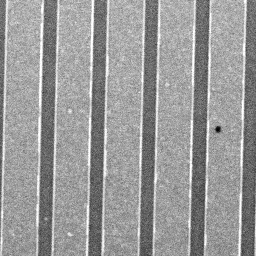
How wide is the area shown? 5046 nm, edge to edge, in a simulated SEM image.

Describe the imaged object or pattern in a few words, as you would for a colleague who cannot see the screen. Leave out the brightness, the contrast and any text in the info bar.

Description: parallel lines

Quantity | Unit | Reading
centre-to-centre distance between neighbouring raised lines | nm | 1000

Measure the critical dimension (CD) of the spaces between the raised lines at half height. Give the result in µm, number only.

0.291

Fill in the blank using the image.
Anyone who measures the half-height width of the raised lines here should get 36.5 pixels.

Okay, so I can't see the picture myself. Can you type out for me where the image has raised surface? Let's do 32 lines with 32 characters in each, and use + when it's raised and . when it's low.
.++++..+++++..++++..++++..+++++.
.++++..+++++..++++..++++..+++++.
.++++..+++++.+++++..++++..+++++.
.++++..+++++.+++++..++++..+++++.
.++++..++++..+++++..++++..+++++.
.++++..++++..+++++..++++..+++++.
.++++..++++..+++++..++++..++++..
.++++..++++..+++++..++++..++++..
.++++..++++..+++++..++++..++++..
.++++..++++..+++++..++++..++++..
.++++..++++..+++++..++++..++++..
.++++..++++..+++++..++++..++++..
.++++..++++..+++++..++++..++++..
.++++..++++..+++++..++++..++++..
.++++..++++..+++++..++++..++++..
.++++..++++..+++++..++++..++++..
.++++..++++..+++++..++++..++++..
.++++..++++..+++++..++++..++++..
+++++..++++..+++++..++++..++++..
+++++..++++..+++++..++++..++++..
+++++..++++..+++++.+++++..++++..
+++++..++++..+++++.+++++..++++..
+++++..++++..++++..+++++..++++..
+++++..++++..++++..+++++..++++..
+++++..++++..++++..+++++..++++..
+++++..++++..++++..+++++..++++..
+++++..++++..++++..+++++..++++..
+++++..++++..++++..+++++..++++..
+++++..++++..++++..+++++..++++..
+++++..++++..++++..+++++..++++..
+++++..++++..++++..+++++..++++..
+++++..++++..++++..+++++..++++..